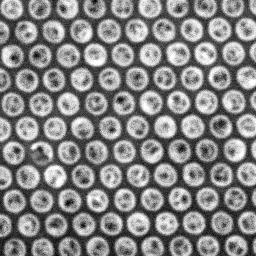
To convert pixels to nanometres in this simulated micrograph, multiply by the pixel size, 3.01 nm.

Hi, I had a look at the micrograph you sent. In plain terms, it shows a regular array of raised bodies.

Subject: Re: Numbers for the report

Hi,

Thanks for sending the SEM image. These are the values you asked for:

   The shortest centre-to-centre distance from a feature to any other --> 82.5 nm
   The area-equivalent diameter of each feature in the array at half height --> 59.2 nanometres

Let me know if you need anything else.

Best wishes